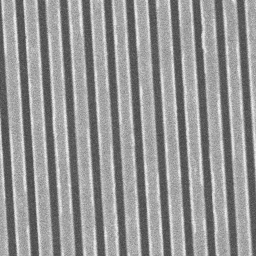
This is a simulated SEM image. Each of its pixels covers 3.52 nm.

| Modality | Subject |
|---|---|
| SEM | parallel lines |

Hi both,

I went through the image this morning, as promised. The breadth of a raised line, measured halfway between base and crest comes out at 48.3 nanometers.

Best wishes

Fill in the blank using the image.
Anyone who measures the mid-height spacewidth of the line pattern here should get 29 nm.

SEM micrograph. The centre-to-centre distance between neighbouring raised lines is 77.8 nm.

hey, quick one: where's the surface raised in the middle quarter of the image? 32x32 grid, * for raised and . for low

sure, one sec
..***...***..***...***..***...**
..***...***..***...***..***...**
..***...***..****..***..***...**
..****..***..****..***..****..**
..****..***..****..***..****..**
..****..***..****..***..****..**
...***..***...***..***...***..**
...***..***...***..***...***..**
...***..***...***..***...***..**
...***..***...***..***...***..**
...***..****..***..***...***..**
...***..****..***..****..***..**
...***..****..***..****..***..**
...***..****..***..****..***..**
*..***..****..***...***..***...*
*..***..****..***...***..***...*
*..***..****..***...***..***...*
*..***...***..***...***..***...*
*..****..***..***...***..***...*
*..****..***..****..***..****..*
*..****..***..****..***..****..*
*..****..***..****..***..****..*
*...***..***...***..***...***..*
*...***..***...***..***...***..*
*...***..***...***..***...***..*
*...***..***...***..***...***..*
*...***..***...***..***...***..*
*...***..****..***..****..***..*
*...***..****..***..****..***..*
*...***..****..***..****..***..*
**..***...***..***...***..***..*
**..***...***..***...***..***...